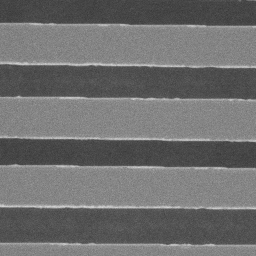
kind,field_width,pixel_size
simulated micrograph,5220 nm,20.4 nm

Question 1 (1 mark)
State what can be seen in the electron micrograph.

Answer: lines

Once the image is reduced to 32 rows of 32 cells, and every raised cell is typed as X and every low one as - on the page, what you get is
--------------------------------
--------------------------------
--------------------------------
XXXXXXXXXXXXXXXXXXXXXXXXXXXXXXXX
XXXXXXXXXXXXXXXXXXXXXXXXXXXXXXXX
XXXXXXXXXXXXXXXXXXXXXXXXXXXXXXXX
XXXXXXXXXXXXXXXXXXXXXXXXXXXXXXXX
XXXXXXXXXXXXXXXXXXXXXXXXXXXXXXXX
--------------------------------
--------------------------------
--------------------------------
--------------------------------
XXXXXXXXXXXXXXXXXXXXXXXXXXXXXXXX
XXXXXXXXXXXXXXXXXXXXXXXXXXXXXXXX
XXXXXXXXXXXXXXXXXXXXXXXXXXXXXXXX
XXXXXXXXXXXXXXXXXXXXXXXXXXXXXXXX
XXXXXXXXXXXXXXXXXXXXXXXXXXXXXXXX
--------------------XXXXXXXXXXXX
--------------------------------
--------------------------------
--------------------------------
XXXXXXXXXXXXXXXXXXXXXXXXXXXXXXXX
XXXXXXXXXXXXXXXXXXXXXXXXXXXXXXXX
XXXXXXXXXXXXXXXXXXXXXXXXXXXXXXXX
XXXXXXXXXXXXXXXXXXXXXXXXXXXXXXXX
XXXXXXXXXXXXXXXXXXXXXXXXXXXXXXXX
--------------------------------
--------------------------------
--------------------------------
--------------------------------
XXXXXXXXXX-X--------------------
XXXXXXXXXXXXXXXXXXXXXXXXXXXXXXXX